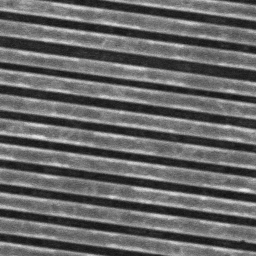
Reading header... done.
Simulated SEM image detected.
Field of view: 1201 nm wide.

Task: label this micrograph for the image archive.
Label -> parallel lines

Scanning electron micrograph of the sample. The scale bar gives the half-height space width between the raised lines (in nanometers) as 46.4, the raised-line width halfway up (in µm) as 0.069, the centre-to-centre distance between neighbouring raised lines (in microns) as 0.115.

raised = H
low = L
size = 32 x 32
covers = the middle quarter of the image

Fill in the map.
HHHHHHHHHHHHHHHHHLLLLLLLLLLLLLLL
HHHHHHHHHHHHHHHHHHHHHHHHLLLLLLLL
LLLLLLLHHHHHHHHHHHHHHHHHHHHHHHHL
LLLLLLLLLLLLLLHHHHHHHHHHHHHHHHHH
HHHHHHLLLLLLLLLLLLLLLLHHHHHHHHHH
HHHHHHHHHHHHHLLLLLLLLLLLLLLLLHHH
HHHHHHHHHHHHHHHHHHHHHLLLLLLLLLLL
LLLLHHHHHHHHHHHHHHHHHHHHHHHHLLLL
LLLLLLLLLLLHHHHHHHHHHHHHHHHHHHHH
LLLLLLLLLLLLLLLLLLHHHHHHHHHHHHHH
HHHHHLLLLLLLLLLLLLLLLLLLLLHHHHHH
HHHHHHHHHHHHLLLLLLLLLLLLLLLLLLLL
HHHHHHHHHHHHHHHHHHHLLLLLLLLLLLLL
HHHHHHHHHHHHHHHHHHHHHHHHHHLLLLLL
LLLLLLLLHHHHHHHHHHHHHHHHHHHHHHHH
LLLLLLLLLLLLLLLHHHHHHHHHHHHHHHHH
HHHLLLLLLLLLLLLLLLLLLLHHHHHHHHHH
HHHHHHHHHHLLLLLLLLLLLLLLLLLLLHHH
HHHHHHHHHHHHHHHHHHLLLLLLLLLLLLLL
HHHHHHHHHHHHHHHHHHHHHHHHHLLLLLLL
LLLLLLHHHHHHHHHHHHHHHHHHHHHHHHHH
LLLLLLLLLLLLLHHHHHHHHHHHHHHHHHHH
HLLLLLLLLLLLLLLLLLLLLHHHHHHHHHHH
HHHHHHHHHLLLLLLLLLLLLLLLLLLLHHHH
HHHHHHHHHHHHHHHHHHLLLLLLLLLLLLLL
HHHHHHHHHHHHHHHHHHHHHHHHHLLLLLLL
LLLLLLHHHHHHHHHHHHHHHHHHHHHHHHHL
LLLLLLLLLLLLLLHHHHHHHHHHHHHHHHHH
HHLLLLLLLLLLLLLLLLLLLHHHHHHHHHHH
HHHHHHHHHLLLLLLLLLLLLLLLLLLLHHHH
HHHHHHHHHHHHHHHHLLLLLLLLLLLLLLLL
HHHHHHHHHHHHHHHHHHHHHHHHLLLLLLLL